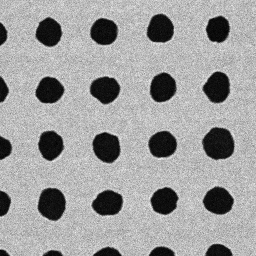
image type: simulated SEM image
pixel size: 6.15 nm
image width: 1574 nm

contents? a regular array of holes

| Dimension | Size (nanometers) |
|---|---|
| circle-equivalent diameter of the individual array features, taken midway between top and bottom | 170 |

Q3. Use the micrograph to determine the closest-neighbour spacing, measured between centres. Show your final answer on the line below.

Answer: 55.4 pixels